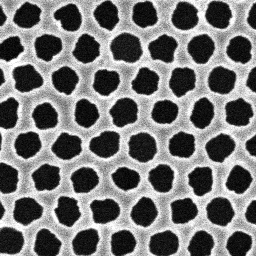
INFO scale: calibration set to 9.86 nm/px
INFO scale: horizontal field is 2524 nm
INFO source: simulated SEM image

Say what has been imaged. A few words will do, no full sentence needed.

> a regular array of holes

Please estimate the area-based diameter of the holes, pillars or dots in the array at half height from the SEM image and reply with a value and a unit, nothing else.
270 nm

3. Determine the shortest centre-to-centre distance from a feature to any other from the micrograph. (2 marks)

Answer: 357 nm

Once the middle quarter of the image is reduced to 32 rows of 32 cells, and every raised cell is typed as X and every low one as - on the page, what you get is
-XXXXXXXXXXXXXXXXXXXXXXXXXXXXXXX
---XXXXXX--X-XXXXXX---XXXXX-----
---XXXXX------XXXX-----XXXX-----
----XXX-------XXXX------XXX-----
----XXX-------XXX-------XX------
---XXXX-------XXX-------XX------
---XXXX------XXXX------XXXX-----
--XXXXXXX--XXXXXXXX---XXXXX---XX
XXXXXXXXXXXXXX--XXXXXXXXXXXXXXXX
XXX----XXXXXX-----XXXXX----XXXXX
XXX-----XXXX------XXXX------XXXX
XXX-----XXX--------XXX-------XXX
XXX------XX-------XXXX-------XXX
XXX------XXX------XXXX------XXXX
XXX-----XXXX------XXXXX----XXXXX
XXXX---XXXXXX--XXXXXXXXXXXXXXXXX
XXXXXXXXXXXXXXXXXXXXXXXXXXXXXXXX
-XXXXXXXX-----XXXX---XXXXXXX----
----XXX-------XX------XXXXX-----
----XX--------XX-------XXX------
----XX--------XX-------XXX------
-----X--------XX-------XXX------
----XXXX-----XXX-------XXXX-----
--XXXXXXX--XXXXXX-----XXXXXXXX-X
XXXXXXXXXXXXXXXXXXX--XXXXXXXXXXX
XXXXXXXXXXXXXXXXXXXXXXX---XXXXXX
XXX-----XXXXX-----XXXX-----XXXXX
XX------XXXX-------XX------XXXX-
XX-------XXX-------XX------XXXX-
XX-------XXX-------XX------XXXX-
XX------XXXXX-----XXXX-----XXXX-
XX-----XXXXXXXX-XXXXXXX----XXXXX